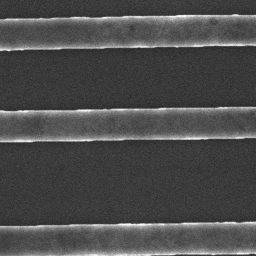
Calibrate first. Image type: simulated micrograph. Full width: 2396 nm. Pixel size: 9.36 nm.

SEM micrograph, lines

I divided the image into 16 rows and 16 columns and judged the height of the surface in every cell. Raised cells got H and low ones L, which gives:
LLLLLLLLLLLLLLLL
HHHHHHHHHHHHHHHH
HHHHHHHHHHHHHHHH
LLLLLLLLLLLLLLLL
LLLLLLLLLLLLLLLL
LLLLLLLLLLLLLLLL
LLLLLLLLLLLLLLLL
HHHHHHHHHHHHHHHH
HHHHHHHHHHHHHHHH
LLLLLLLLLLLLLLLL
LLLLLLLLLLLLLLLL
LLLLLLLLLLLLLLLL
LLLLLLLLLLLLLLLL
LLLLLLLLLLLLLLLL
HHHHHHHHHHHHHHHH
HHHHHHHHHHHHHHHH